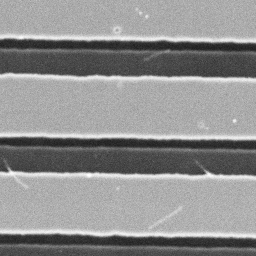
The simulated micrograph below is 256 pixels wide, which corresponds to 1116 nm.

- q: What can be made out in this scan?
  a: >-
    lines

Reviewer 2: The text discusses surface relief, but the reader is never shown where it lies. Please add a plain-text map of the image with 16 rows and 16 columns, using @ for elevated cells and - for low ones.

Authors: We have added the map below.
@@@@@@@@@@@@@@@@
@@@@@@@@@@@@@@@@
-----@--@@@@@@@@
----------------
----------------
@@@@@@@@@@@@@@@@
@@@@@@@@@@@@@@@@
@@@@@@@@@@@@@@@@
@@@@@@@@@@@@@@@@
----------------
----------------
@@@@@@@@@@@@@@@@
@@@@@@@@@@@@@@@@
@@@@@@@@@@@@@@@@
@@@@@@@@@@@@@@@@
----------------